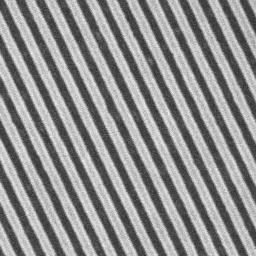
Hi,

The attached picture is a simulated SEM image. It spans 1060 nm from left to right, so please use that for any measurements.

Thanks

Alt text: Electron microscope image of parallel lines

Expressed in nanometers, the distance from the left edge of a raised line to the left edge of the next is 75.8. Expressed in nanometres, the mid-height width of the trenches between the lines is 37.3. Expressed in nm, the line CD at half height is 37.3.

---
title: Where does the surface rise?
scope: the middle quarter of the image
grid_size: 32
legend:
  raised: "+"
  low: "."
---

+..+++..+++...++...++...++...++.
+...++...++...++...++...++...+++
+...+++..+++...++...++..+++..+++
++...++...++...++...++...+++..++
++...+++..+++..+++..+++..+++..++
.++...++...++...++...++...++...+
.++...+++..+++..+++..+++..+++..+
.+++...++...++...++...++...++...
..++...+++..+++..+++..+++..+++..
..+++..+++...++...++...++...++..
...++...++...+++..+++..+++..+++.
+...++...++...++...++...++...++.
++..++...++...++...++...+++..+++
++..+++..+++...++...++...++...++
++...++...++...++...+++..+++..++
+++..+++..+++...++...++...++...+
.++...++...++...++...++...+++..+
.+++...++..+++..+++..+++...++...
..++...++...++...++...++...+++..
..+++..+++..+++..+++...++...++..
...++...++...++...++...+++..+++.
+..+++..+++..+++..+++..+++..+++.
+..+++...++...++...++...++...++.
++..+++..+++..+++..+++...++...++
++...++...++...++...++...++...++
+++..+++..+++..+++..+++...++...+
.++...++...++...++...++...++...+
.++...++...++...+++..+++..+++..+
..++...++...++...++...++...++...
..++...++...++...+++..+++..+++..
..+++...++..+++..+++...++...++..
...++...++...++...+++..+++..+++.